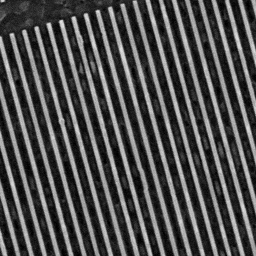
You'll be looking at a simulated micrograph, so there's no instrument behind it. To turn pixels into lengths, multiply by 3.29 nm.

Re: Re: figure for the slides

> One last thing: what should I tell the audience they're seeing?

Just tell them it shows parallel lines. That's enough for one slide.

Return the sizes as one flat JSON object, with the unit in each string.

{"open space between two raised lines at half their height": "9.54 pixels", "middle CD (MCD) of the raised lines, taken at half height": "3.53 px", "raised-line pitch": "12.7 px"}